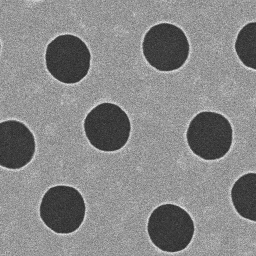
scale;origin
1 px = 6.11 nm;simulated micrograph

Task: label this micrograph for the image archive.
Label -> holes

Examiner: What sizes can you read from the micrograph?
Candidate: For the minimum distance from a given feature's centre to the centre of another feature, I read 586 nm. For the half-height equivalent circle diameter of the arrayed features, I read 0.287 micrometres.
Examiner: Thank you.